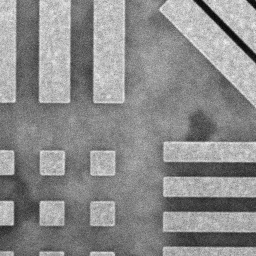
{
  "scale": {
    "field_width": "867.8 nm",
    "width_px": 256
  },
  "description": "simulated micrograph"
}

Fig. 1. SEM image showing groups of lines, slits or small figures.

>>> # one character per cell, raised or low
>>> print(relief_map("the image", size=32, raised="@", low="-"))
@@---@@@@---@@@-----@@@@@-@@@@@-
@@---@@@@---@@@-----@@@@@@-@@@@@
@@---@@@@---@@@------@@@@@@-@@@@
@@---@@@@---@@@-------@@@@@@-@@@
@@---@@@@---@@@--------@@@@@--@@
@@---@@@@---@@@---------@@@@@--@
@@---@@@@---@@@----------@@@@@--
@@---@@@@---@@@-----------@@@@@-
@@---@@@@---@@@------------@@@@@
@@---@@@@---@@@-------------@@@@
@@---@@@@---@@@--------------@@@
@@---@@@@---@@@---------------@@
@@---@@@@---@@@----------------@
--------------------------------
--------------------------------
--------------------------------
--------------------------------
--------------------------------
--------------------@@@@@@@@@@@@
@@---@@@---@@@------@@@@@@@@@@@@
@@---@@@---@@@------------------
@@---@@@---@@@------------------
--------------------@@@@@@@@@@@@
--------------------@@@@@@@@@@@@
---------------------@@@@@@@@@@@
@@---@@@---@@@------------------
@@---@@@---@@@------------------
@@---@@@---@@@------@@@@@@@@@@@@
--------------------@@@@@@@@@@@@
--------------------------------
--------------------------------
@-------------------@@@@@@@@@@@@